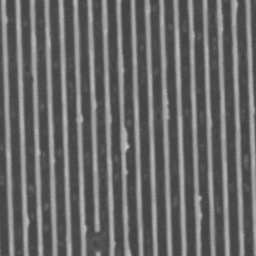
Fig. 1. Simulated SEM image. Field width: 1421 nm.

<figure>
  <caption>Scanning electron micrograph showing parallel lines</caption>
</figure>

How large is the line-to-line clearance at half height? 0.0547 µm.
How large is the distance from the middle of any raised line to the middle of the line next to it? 79.7 nanometers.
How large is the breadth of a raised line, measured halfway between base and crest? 24.9 nanometres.